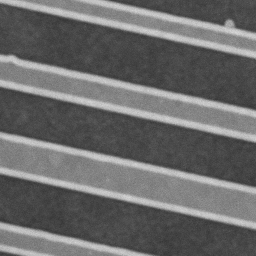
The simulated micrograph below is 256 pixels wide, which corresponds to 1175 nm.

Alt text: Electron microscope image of one or a few lines or trenches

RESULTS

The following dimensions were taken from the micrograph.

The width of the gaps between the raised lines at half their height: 248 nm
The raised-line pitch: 367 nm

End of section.